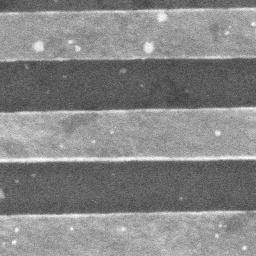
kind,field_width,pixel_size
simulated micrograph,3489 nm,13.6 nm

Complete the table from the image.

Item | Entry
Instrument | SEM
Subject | lines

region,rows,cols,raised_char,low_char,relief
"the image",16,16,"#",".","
................
################
################
################
................
................
................
################
################
################
................
................
................
.###############
################
################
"